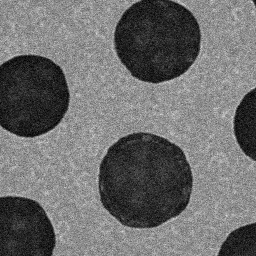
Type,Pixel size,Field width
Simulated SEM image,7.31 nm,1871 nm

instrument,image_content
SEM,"holes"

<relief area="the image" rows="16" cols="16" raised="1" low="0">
1111111100001111
1111111000001111
1111111000000111
1011111000001111
0000111100001111
0000111111111111
0000111111111110
0000111111111110
1011111100111110
1111111000011110
1111110000001111
1111110000001111
0011110000001111
0001111000011111
0001111111111110
0001111111111100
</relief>